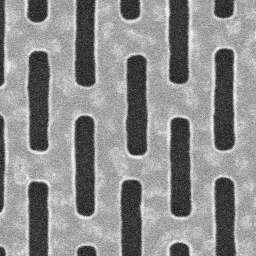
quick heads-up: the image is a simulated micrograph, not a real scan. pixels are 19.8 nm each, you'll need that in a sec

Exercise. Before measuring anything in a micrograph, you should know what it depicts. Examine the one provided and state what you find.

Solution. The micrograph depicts holes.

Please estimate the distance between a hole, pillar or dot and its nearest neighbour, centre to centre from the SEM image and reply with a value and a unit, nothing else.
1560 nm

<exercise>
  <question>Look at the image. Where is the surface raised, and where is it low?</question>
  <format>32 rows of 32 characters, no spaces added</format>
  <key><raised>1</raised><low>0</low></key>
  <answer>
01100011100011100011100011100111
01100011100011100011100011100111
01110011100011111111100011111111
01111111100011111111100011111111
01111111100011111111100011111111
01111111100011111111100011111111
01110011100011111111100011100111
01110011100011110011100011100111
01110011100011110011100011100111
01110011100011110011100011100111
11100011110011110011110111100111
11100011111111110011111111100111
11110011111111110011111111100111
11110011111111110011111111100111
11110011110111110001111111100111
01110011100011110001100011100111
01100011100011110011100011100111
01110011100011110011100011100011
01110011100011110011100011100111
01111111100011111011100011111111
01111111100011111111100011111111
01111111100011111111100011111111
01111111100011110111100011100111
01100011100011100011100011100111
01100011100011100011100011100111
01100011100011100011100011100111
11100011110011100011100011100111
11100011111111100011111111100111
11110011111111100011111111100111
11100011111111100011111111100111
11110011111111100011100111100111
01110011110011100011100011100011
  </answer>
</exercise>